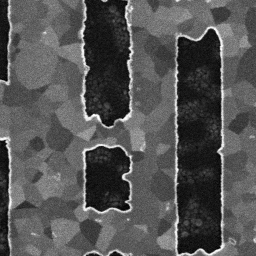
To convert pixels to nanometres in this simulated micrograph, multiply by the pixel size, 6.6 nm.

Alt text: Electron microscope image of one or a few lines or trenches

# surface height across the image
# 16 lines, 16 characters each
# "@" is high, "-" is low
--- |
-@@@@---@@@@@@@@
-@@@@---@@@@@@@@
-@@@@---@@@---@@
-@@@@---@@@---@@
-@@@@---@@@---@@
@@@@@---@@@---@@
@@@@@---@@@---@@
@@@@@@-@@@@---@@
@@@@@@@@@@@---@@
-@@@@@--@@@---@@
-@@@@---@@@---@@
-@@@@---@@@---@@
-@@@@---@@@---@@
-@@@@@@@@@@---@@
-@@@@@@@@@@---@@
-@@@@@@@@@@---@@